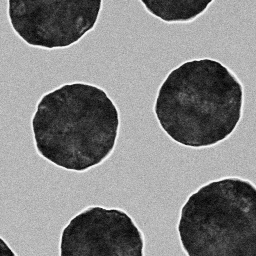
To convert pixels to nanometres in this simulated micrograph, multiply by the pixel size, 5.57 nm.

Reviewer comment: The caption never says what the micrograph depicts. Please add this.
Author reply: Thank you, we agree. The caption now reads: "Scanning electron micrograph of holes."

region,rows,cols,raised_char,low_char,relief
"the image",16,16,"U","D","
UDDDDDUUUDDDDUUU
UDDDDDUUUUUUUUUU
UUDDDUUUUUUUUUUU
UUUUUUUUUUUUUUUU
UUUUUUUUUUUDDDUU
UUUUDDUUUUDDDDDU
UUDDDDDUUUDDDDDU
UUDDDDDUUUDDDDDU
UUDDDDDUUUUDDDUU
UUUDDDDUUUUUUUUU
UUUUDUUUUUUUUUUU
UUUUUUUUUUUUUDDD
UUUUUUUUUUUUDDDD
UUUUUDDDUUUDDDDD
UUUUDDDDDUUDDDDD
DUUUDDDDDUUUDDDD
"